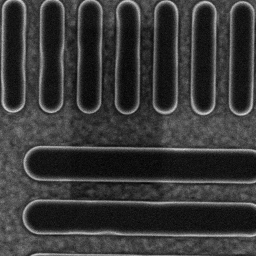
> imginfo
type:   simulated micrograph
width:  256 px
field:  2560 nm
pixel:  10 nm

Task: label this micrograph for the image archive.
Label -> groups of lines, slits or small figures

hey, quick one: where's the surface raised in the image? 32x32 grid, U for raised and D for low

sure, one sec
DUUDDUUUDDUUDDDUUDDDUUDDDUDDDUUD
UUUDDUUUDDUUUDDUUDDUUUDDUUUDDUUU
UUUDDUUUDDUUUDDUUDDUUUDDUUUDDUUU
UUUDDUUUDDUUUDDUUDDUUUDDUUUDDUUU
UUUDDUUUDDUUUDDUUDDUUUDDUUUDDUUU
UUUDDUUUDDUUUDDUUDDUUUDDUUUDDUUU
UUUDDUUUDDUUUDDUUDDUUUDDUUUDDUUU
UUUDDUUUDDUUUDDUUDDUUUDDUUUDDUUU
UUUDDUUUDDUUUDUUUDDUUUDDUUUDDUUU
UUUDDUUUDDUUUDUUUDDUUUDDUUUDDUUU
UUUDDUUUDDUUUDUUUDDUUUDDUUUDDUUU
UUUDDUUUDDUUUDUUUDDUUUDDUUUDDUUU
UUUDDUUUDDUUUDUUUDDUUUDDUUUDDUUD
DUUDDUUDDDUUDDDUUDDUUUDDUUUDDUUD
DDDDDDDDDDDDDDDDDDDDDDDDDDDDDDDD
DDDDDDDDDDDDDDDDDDDDDDDDDDDDDDDD
DDDDDDDDDDDDDDDDDDDDDDDDDDDDDDDD
DDDDDDDDDDDDDDDDDDDDDDDDDDDDDDDD
DDDDUUUUUUUUUUUDDDDDDDDDDDDDDDDD
DDDUUUUUUUUUUUUUUUUUUUUUUUUUUUUU
DDDUUUUUUUUUUUUUUUUUUUUUUUUUUUUU
DDDUUUUUUUUUUUUUUUUUUUUUUUUUUUUU
DDDDDUUUUUUUUUUUUUUUUUUUUUUUUUUU
DDDDDDDDDDDDDDDDDDDDDDDDDDDDDDDD
DDDDDDDDDDDDDDDDDDDDDDDDDDDDDDDD
DDDDUUUUUUUUUUUUUUUUUUUUUUUUUUUU
DDDUUUUUUUUUUUUUUUUUUUUUUUUUUUUU
DDDUUUUUUUUUUUUUUUUUUUUUUUUUUUUU
DDDUUUUUUUUUUUUUUUUUUUUUUUUUUUUU
DDDDDDDDDDDDDDDDDDDDDDDDDDDDDDDD
DDDDDDDDDDDDDDDDDDDDDDDDDDDDDDDD
DDDDDDDDDDDDDDDDDDDDDDDDDDDDDDDD